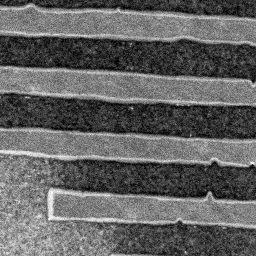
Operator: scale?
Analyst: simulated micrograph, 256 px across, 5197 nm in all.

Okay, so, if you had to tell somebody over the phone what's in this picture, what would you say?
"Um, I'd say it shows parallel lines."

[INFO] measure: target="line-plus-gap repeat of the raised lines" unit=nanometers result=1230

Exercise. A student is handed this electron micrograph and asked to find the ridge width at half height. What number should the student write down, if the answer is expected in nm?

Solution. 522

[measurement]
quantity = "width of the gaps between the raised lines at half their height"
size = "725 nm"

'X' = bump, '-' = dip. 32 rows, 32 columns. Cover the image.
--------------------------------
XXXXXXXXXXXXXXXX----------------
XXXXXXXXXXXXXXXXXXXXXXXXXXXXXXXX
XXXXXXXXXXXXXXXXXXXXXXXXXXXXXXXX
--------X-XXXXXXXXXXXXXXXXXXXXXX
-------------------------------X
--------------------------------
--------------------------------
XXX-----------------------------
XXXXXXXXXXXXXXXXXXX-------------
XXXXXXXXXXXXXXXXXXXXXXXXXXXXXXXX
--XXXXXXXXXXXXXXXXXXXXXXXXXXXXXX
--------------XXXXXXXXXXXXXXXXXX
--------------------------------
--------------------------------
--------------------------------
XXXXXXXX------------------------
XXXXXXXXXXXXXXXXXXXXXXXXXX------
XXXXXXXXXXXXXXXXXXXXXXXXXXXXXXXX
------XXXXXXXXXXXXXXXXXXXXXXXXXX
----------------------------XXXX
--------------------------------
--------------------------------
--------------------------------
------XXXXXXXXXXX---------X-----
------XXXXXXXXXXXXXXXXXXXXXXXXXX
------XXXXXXXXXXXXXXXXXXXXXXXXXX
--------------XXXXXXXXXXXXXXXXXX
--------------------------------
--------------------------------
--------------------------------
--------------------------------